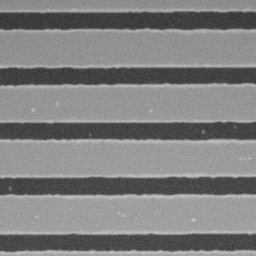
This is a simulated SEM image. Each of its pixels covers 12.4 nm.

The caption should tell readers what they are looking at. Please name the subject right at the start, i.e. lines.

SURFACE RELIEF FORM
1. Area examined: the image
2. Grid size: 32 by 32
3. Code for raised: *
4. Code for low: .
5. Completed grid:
********************************
................................
................................
................................
********************************
********************************
********************************
********************************
................................
................................
..............................*.
********************************
********************************
********************************
********************************
................................
................................
**.......******...........**....
********************************
********************************
********************************
********************************
................................
................................
********************************
********************************
********************************
********************************
********************************
................................
................................
*.******************************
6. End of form